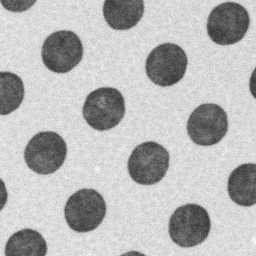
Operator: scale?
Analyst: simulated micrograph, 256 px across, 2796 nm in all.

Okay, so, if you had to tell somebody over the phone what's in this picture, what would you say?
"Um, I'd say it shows a regular array of holes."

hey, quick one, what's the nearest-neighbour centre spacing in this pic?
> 771 nm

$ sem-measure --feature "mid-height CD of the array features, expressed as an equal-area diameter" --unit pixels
43.2